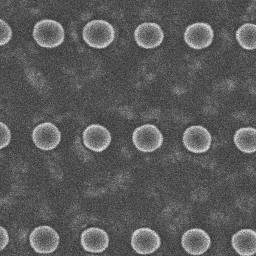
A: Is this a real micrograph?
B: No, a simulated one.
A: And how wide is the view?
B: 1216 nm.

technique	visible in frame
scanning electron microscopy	a regular array of raised bodies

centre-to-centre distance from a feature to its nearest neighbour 238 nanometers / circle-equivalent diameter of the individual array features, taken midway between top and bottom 127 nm